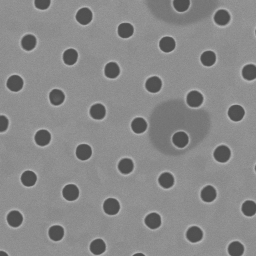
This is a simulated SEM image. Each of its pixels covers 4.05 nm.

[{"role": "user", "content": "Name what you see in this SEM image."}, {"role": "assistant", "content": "a regular array of holes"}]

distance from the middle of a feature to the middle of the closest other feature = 0.173 microns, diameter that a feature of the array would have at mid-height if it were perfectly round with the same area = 0.0675 um